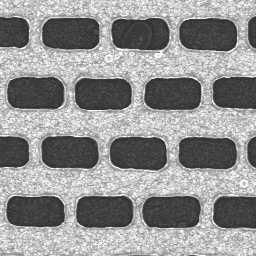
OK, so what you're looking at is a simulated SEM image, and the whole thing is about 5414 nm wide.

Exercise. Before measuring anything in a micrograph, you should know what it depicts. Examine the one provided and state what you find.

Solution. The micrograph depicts a regular array of holes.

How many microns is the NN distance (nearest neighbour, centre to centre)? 1.43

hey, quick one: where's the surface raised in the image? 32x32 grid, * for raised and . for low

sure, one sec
********************************
********************************
...***......***.....***......**.
....*........*.......*........*.
....*........*.......*........*.
...***......**.......**.......*.
********************************
********************************
********************************
********************************
*.......**......**.......**.....
*.......*........*.......**.....
*.......*.......**.......**.....
**.....***......***.....****....
********************************
********************************
********************************
...**.......**......***......**.
....*.......**.......*........*.
....*.......**.......*........*.
...***......**.......**......**.
********************************
********************************
********************************
***********..*********..********
*.......**.......*.......**.....
*.......**.......*.......**.....
*.......**.......*.......**.....
***********..*******....****.**.
********************************
********************************
********************************